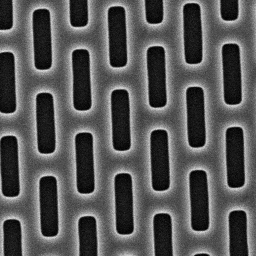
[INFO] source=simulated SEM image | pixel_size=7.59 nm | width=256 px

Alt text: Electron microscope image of groups of lines, slits or small figures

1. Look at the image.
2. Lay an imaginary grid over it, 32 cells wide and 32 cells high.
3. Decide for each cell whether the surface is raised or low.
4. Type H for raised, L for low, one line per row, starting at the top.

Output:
LLHHHHHHHLLHHHHHHHLLHHHLLHHLLLHH
LLHHLLHHHLLHHHLLHHLLLHHLLHHHLLHH
LLHHLLHHHLLHHLLLHHLLHHHLLHHHLHHH
LHHHLLHHHHHHHLLLHHHHHHHLLHHHHHHH
HHHHLLHHHHHHHHLLHHHHHHHLLHHHHHHH
HHHHLLHHHHHHHHLLHHHHHHHLLHHHHHHH
HHHHLLLHHLLHHHLLHHLLLHHLLHHHLLHH
LLHHLLLHHLLHHHLLHHLLLHHLLHHHLLHH
LLHHHLHHHLLHHHHHHHLLLHHHHHHHLLHH
LLHHHHHHHLLHHHHHHHLLLHHHHHHHLLHH
LLHHHHHHHLLHHHHHHHLLLHHHHHHHLLHH
LLHHHHHHHLLHHHLLHHLLLHHLLHHHLLHH
LLHHLLLHHLLLHHLLHHHLLHHLLLHHLLHH
LLHHLLLHHLLHHHLLHHHLHHHLLLHHHHHH
HHHHLLLHHHHHHHLLHHHHHHHLLLHHHHHH
HHHHLLLHHHHHHHLLHHHHHHHLLLHHHHHH
HHHHHLLHHHHHHHLLHHHLLHHLLLHHLLHH
LLHHHLLHHLLLHHLLHHHLLHHHLLHHLLLH
LLHHHLLHHLLLHHLLHHHLLHHHLHHHLLLH
LLHHHHHHHLLLHHHHHHHLLHHHHHHHLLLH
LLHHHHHHHLLLHHHHHHHLLHHHHHHHLLLH
LLHHHHHHHHLLHHHHHHHLLHHHLLHHLLLH
LLHHHLLHHHLLHHLLHHHLLHHHLLHHLLLH
LLLHHLLHHHLLHHLLLHHLLHHHLLHHHHHH
HLHHHLLHHHHHHHLLLHHHHHHHLLHHHHHH
HHHHHLLHHHHHHHLLLHHHHHHHLLHHHHHH
HHHHHLLHHHHHHHLLLHHHHHHHLLHHHLHH
HLHHHLLHHHLLHHLLLHHLLHHHLLHHLLLH
LLLHHLLHHHLLHHHLLHHLLLHHLLHHHLLH
LLLHHHLHHHLLHHHHHHHLLLHHHHHHHLLH
LLLHHHHHHHLLHHHHHHHLLLHHHHHHHLLH
LLLHHHHHHHLLHHHHHHHLLLHHHHHHHLLH